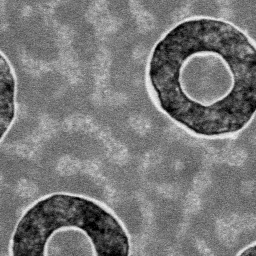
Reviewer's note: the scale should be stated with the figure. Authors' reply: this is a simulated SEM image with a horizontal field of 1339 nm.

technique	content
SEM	ring-shaped grooves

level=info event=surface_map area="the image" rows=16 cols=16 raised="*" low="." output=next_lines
****************
***********...**
**********......
*********...**..
.********..***..
.********..***..
.*********......
.**********.....
*************.**
****************
****************
****************
***...**********
*......*********
*..**...********
*..***..********